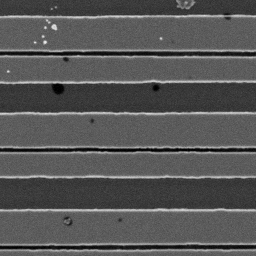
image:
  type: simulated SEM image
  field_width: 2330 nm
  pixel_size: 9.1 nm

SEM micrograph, lines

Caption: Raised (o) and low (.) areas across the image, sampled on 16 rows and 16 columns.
................
oooooooooooooooo
oooooooooooooooo
oooooooooooooooo
oooooooooooooooo
................
................
oooooooooooooooo
oooooooooooooooo
oooooooooooooooo
oooooooooooooooo
................
................
oooooooooooooooo
oooooooooooooooo
oooooooooooooooo